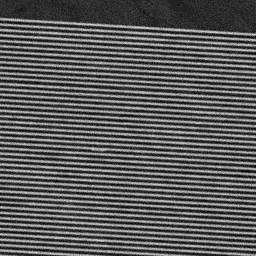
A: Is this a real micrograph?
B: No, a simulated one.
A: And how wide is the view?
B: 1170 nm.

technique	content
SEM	parallel lines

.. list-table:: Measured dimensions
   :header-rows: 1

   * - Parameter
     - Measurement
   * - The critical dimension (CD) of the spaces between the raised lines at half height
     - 0.0154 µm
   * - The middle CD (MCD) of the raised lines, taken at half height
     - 8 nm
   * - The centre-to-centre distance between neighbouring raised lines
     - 24.6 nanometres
